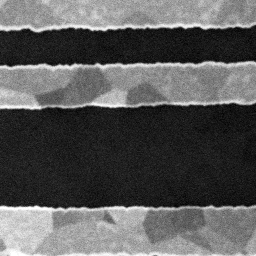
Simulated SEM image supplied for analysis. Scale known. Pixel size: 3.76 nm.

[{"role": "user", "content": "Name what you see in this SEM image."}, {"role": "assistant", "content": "lines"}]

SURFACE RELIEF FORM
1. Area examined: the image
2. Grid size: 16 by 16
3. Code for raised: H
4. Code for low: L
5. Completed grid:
HHHHHHHHHHHHHHHH
HHHHHHHHHHHHHHHH
LLLLLLLLLLLLLLLL
LLLLLLLLLLLLLLLL
HHHHHHHHHHHHHHHH
HHHHHHHHHHHHHHHH
HHHHHHHHHHHHHHLH
LLLLLLLLLLLLLLLL
LLLLLLLLLLLLLLLL
LLLLLLLLLLLLLLLL
LLLLLLLLLLLLLLLL
LLLLLLLLLLLLLLLL
LLLLLLLLLLLLLLLL
HHHHHHHHHHHHHHHH
HHHHHHHHHHHHHHHH
HHHHHHHHHHHHHHHH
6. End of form